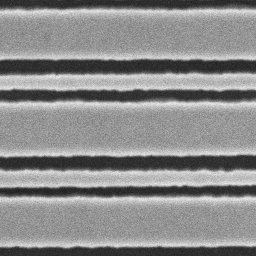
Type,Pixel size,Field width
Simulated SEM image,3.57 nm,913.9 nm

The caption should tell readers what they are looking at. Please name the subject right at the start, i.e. lines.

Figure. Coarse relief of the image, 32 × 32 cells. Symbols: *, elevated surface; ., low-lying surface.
................................
********************************
********************************
********************************
********************************
********************************
********************************
................................
................................
.***.***************************
********************************
................................
................................
********************************
********************************
********************************
********************************
********************************
********************************
*...............................
................................
***************.************.***
********************************
................................
*........**..............*......
********************************
********************************
********************************
********************************
********************************
********************************
................................